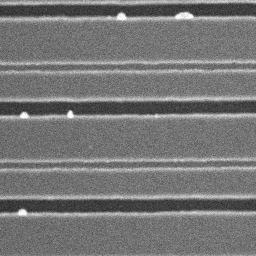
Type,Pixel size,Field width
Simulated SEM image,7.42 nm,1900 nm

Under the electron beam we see lines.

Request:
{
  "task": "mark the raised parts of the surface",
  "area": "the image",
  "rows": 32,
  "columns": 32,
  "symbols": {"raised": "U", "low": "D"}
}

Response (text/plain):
DDDDDDDDDDDDDDDDDDDDDDDDDDDDDDDD
DDDDDDDDDDDDDDDDDDDDDDDDDDDDDDDD
UUUUUUUUUUUUUUUUUUUUUUUUUUUUUUUU
UUUUUUUUUUUUUUUUUUUUUUUUUUUUUUUU
UUUUUUUUUUUUUUUUUUUUUUUUUUUUUUUU
UUUUUUUUUUUUUUUUUUUUUUUUUUUUUUUU
UUUUUUUUUUUUUUUUUUUUUUUUUUUUUUUU
UUUUUUUUUUUUUUUUUUUUUUUUUUUUUUUU
UUUUUUUUUUUUUUUUUUUUUUUUUUUUUUUU
UUUUUUUUUUUUUUUUUUUUUUUUUUUUUUUU
UUUUUUUUUUUUUUUUUUUUUUUUUUUUUUUU
UUUUUUUUUUUUUUUUUUUUUUUUUUUUUUUU
UUUUUUUUUUUDDDUDDDDDDDDDDDDDDDDD
DDDDDDDDDDDDDDDDDDDDDDDDDDDDDDDD
DDUUDDDDUUDDDUDUUUUUUUUUUUUUUUUU
UUUUUUUUUUUUUUUUUUUUUUUUUUUUUUUU
UUUUUUUUUUUUUUUUUUUUUUUUUUUUUUUU
UUUUUUUUUUUUUUUUUUUUUUUUUUUUUUUU
UUUUUUUUUUUUUUUUUUUUUUUUUUUUUUUU
UUUUUUUUUUUUUUUUUUUUUUUUUUUUUUUU
UUUUUUUUUUUUUUUUUUUUUUUUUUUUUUUU
UUUUUUUUUUUUUUUUUUUUUUUUUUUUUUUU
UUUUUUUUUUUUUUUUUUUUUUUUUUUUUUUU
UUUUUUUUUUUUUUUUUUUUUUUUUUUUUUUU
UUUUUUUUUUUUUUUUUUUUUUUUUUUUUUUU
DDDDDDDDDDDDDDDDDDDDDDDDDDDDDDDD
DDUDDDDDDDDDDDDDDDDDDDDDDDDDDDDD
UUUUUUUUUUUUUUUUUUUUUUUUUUUUUUUU
UUUUUUUUUUUUUUUUUUUUUUUUUUUUUUUU
UUUUUUUUUUUUUUUUUUUUUUUUUUUUUUUU
UUUUUUUUUUUUUUUUUUUUUUUUUUUUUUUU
UUUUUUUUUUUUUUUUUUUUUUUUUUUUUUUU